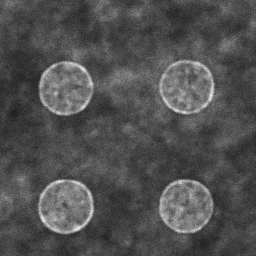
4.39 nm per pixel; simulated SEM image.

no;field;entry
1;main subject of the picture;raised bodies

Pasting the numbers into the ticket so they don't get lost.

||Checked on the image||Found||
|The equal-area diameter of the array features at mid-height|232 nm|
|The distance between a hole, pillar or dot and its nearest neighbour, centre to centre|522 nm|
